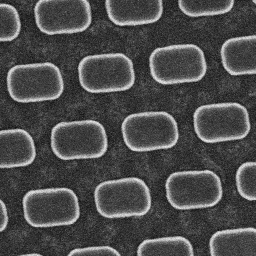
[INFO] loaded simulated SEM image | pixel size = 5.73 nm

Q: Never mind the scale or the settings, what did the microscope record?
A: a regular array of raised bodies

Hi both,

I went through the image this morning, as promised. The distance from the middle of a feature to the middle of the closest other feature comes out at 411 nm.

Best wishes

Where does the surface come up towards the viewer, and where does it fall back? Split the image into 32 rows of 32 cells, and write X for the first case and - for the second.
-----XXXXXX--XXXXXXX--XXXXXXX---
XX--XXXXXXX---XXXXXX---XXXXX----
XX---XXXXXX---XXXXX-------------
XX---XXXXXX---------------------
XX------------------------------
----------------------------XXXX
-------------------XXXXXX---XXXX
----------XXXXXX---XXXXXX---XXXX
--XXXXX---XXXXXX---XXXXXXX--XXXX
-XXXXXXX--XXXXXXX--XXXXXX-------
-XXXXXXX--XXXXXX----------------
-XXXXXXX------------------------
--XXX---------------------------
-------------------------XXXXX--
----------------XXXXX---XXXXXXX-
--------XXXX---XXXXXXX--XXXXXXX-
XXX----XXXXXX--XXXXXXX---XXXXXX-
XXXX---XXXXXX---XXXXXX----X-----
XXXX---XXXXXX---XXXX------------
XXXX---XXXXX--------------------
XXX----------------------------X
-------------------------X----XX
---------------XX----XXXXXX---XX
------------XXXXXX---XXXXXXX--XX
---XXXXXX---XXXXXXX--XXXXXXX--XX
---XXXXXXX--XXXXXXX---XXXXX-----
X--XXXXXXX---XXXXX--------------
X--XXXXXX-----------------------
--------------------------------
---------------------------XXXXX
------------------XXXXXX--XXXXXX
---------XXXXX---XXXXXXX--XXXXXX